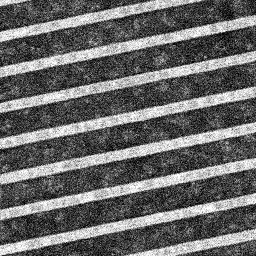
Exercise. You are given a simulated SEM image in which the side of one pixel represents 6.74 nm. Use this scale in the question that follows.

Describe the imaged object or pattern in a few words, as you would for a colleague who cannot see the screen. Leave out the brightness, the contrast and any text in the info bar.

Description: parallel lines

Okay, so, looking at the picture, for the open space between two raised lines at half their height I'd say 173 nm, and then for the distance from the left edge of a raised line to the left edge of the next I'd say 0.235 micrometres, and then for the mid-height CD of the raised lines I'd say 60.3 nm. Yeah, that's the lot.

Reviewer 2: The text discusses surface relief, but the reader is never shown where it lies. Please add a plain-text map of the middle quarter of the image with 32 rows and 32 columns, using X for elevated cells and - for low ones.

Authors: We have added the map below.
------------------------------XX
-------------------------XXXXXXX
--------------------XXXXXXXXXXXX
---------------XXXXXXXXXX-------
----------XXXXXXXXXXXX----------
-----XXXXXXXXXXXX---------------
XXXXXXXXXXXX--------------------
XXXXXX--------------------------
XX------------------------------
------------------------------XX
-------------------------XXXXXXX
--------------------XXXXXXXXXXX-
---------------XXXXXXXXXXX------
----------XXXXXXXXXXXX----------
-----XXXXXXXXXXX----------------
XXXXXXXXXXXX--------------------
XXXXXXX-------------------------
XX------------------------------
-----------------------------XXX
------------------------XXXXXXXX
-------------------XXXXXXXXXXXX-
--------------XXXXXXXXXXXX------
---------XXXXXXXXXXXX-----------
----XXXXXXXXXXXX----------------
XXXXXXXXXXX---------------------
XXXXXX--------------------------
X-------------------------------
-----------------------------XXX
------------------------XXXXXXXX
-------------------XXXXXXXXXXX--
--------------XXXXXXXXXXX-------
--------XXXXXXXXXXXX------------